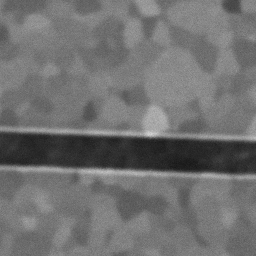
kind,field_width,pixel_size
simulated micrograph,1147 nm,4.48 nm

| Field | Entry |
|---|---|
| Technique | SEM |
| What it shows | one or a few lines or trenches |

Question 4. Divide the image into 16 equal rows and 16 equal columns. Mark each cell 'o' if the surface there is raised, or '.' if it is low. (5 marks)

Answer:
oooooooooooooooo
oooooooooooooooo
oooooooooooooooo
oooooooooooooooo
oooooooooooooooo
oooooooooooooooo
oooooooooooooooo
oooooooooooooooo
..........oooooo
................
o...............
oooooooooooooooo
oooooooooooooooo
oooooooooooooooo
oooooooooooooooo
oooooooooooooooo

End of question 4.